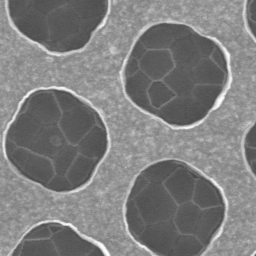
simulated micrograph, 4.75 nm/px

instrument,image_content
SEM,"holes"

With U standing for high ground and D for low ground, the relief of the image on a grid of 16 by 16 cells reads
UDDDDDDUUUUUUUUD
UDDDDDUUUUDUUUUD
UUDDDDUUUDDDDUUU
UUUUUUUUDDDDDDUU
UUUUUUUUDDDDDDUU
UUUUUUUUDDDDDDUU
UDDDDUUUDDDDDUUU
UDDDDDUUUUDDUUUU
DDDDDDDUUUUUUUUD
DDDDDDDUUUUUUUUD
UDDDDDUUUDDDUUUU
UUDDDUUUDDDDDUUU
UUUUUUUUDDDDDDUU
UUUUUUUUDDDDDDUU
UUDDDUUUDDDDDDUU
UDDDDDUUUDDDDUUU